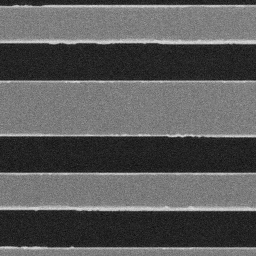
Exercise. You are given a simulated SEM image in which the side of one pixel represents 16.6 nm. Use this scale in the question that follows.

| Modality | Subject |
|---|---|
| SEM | lines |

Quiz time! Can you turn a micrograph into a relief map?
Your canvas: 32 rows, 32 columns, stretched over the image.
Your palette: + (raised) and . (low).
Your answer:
................................
++++++++++++++++++++++++++++++++
++++++++++++++++++++++++++++++++
++++++++++++++++++++++++++++++++
++++++++++++++++++++++++++++++++
................................
................................
................................
................................
................................
++++++++++++++++++++++++++++++++
++++++++++++++++++++++++++++++++
++++++++++++++++++++++++++++++++
++++++++++++++++++++++++++++++++
++++++++++++++++++++++++++++++++
++++++++++++++++++++++++++++++++
++++++++++++++++++++++++++++++++
................................
................................
................................
................................
................................
++++++++++++++++++++++++++++++++
++++++++++++++++++++++++++++++++
++++++++++++++++++++++++++++++++
++++++++++++++++++++++++++++++++
................................
................................
................................
................................
................................
++++++++++++++++++++++++++++++++